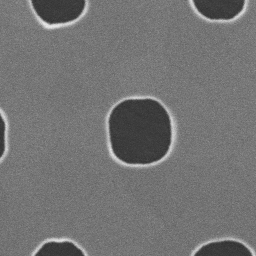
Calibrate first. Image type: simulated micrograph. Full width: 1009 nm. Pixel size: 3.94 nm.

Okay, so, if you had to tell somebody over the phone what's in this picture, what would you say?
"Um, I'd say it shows holes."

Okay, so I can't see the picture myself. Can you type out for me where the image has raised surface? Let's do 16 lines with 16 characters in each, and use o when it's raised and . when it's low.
oo...ooooooo...o
ooo.oooooooooooo
oooooooooooooooo
oooooooooooooooo
oooooooooooooooo
oooooooooooooooo
ooooooo...oooooo
ooooooo....ooooo
ooooooo....ooooo
ooooooo...oooooo
oooooooooooooooo
oooooooooooooooo
oooooooooooooooo
oooooooooooooooo
oooooooooooooooo
ooo..oooooooo..o